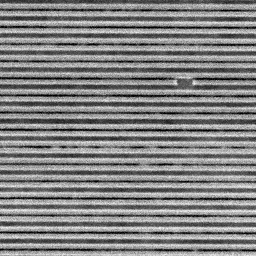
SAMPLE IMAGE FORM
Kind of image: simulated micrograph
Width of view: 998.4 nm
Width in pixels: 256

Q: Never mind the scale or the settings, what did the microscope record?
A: parallel lines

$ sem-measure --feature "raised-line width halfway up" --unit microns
0.021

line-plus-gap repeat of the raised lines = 33.4 nm